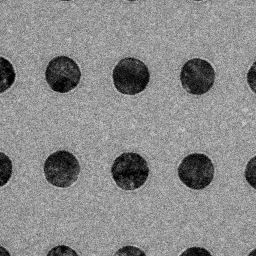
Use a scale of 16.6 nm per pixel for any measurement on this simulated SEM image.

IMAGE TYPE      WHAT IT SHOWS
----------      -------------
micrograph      holes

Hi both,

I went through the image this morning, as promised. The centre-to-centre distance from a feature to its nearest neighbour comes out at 1110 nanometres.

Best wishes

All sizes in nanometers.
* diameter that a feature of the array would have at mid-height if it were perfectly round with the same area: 627